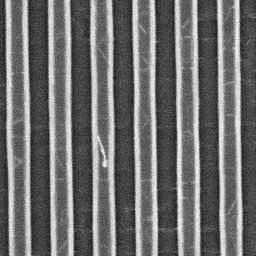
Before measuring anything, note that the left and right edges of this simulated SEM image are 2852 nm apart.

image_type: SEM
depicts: wiring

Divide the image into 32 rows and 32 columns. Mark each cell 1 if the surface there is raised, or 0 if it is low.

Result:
01100011000011000110001100011100
01100011000011000110001100011100
01100011100011000110001100011100
01100011100011000110001100011100
01100011100011000110001100001100
01100011100011000110001100001100
01100011100011000110001100001100
01100011100011000110001100001100
01100011100011000110001100001100
01100011100011000110001100001100
01100011100011000110001100001100
01100011100011000110001110001100
01100011100011000110001110001100
01100011100011000110001110001100
01100011100011000110001110001100
01100011100011000110001110001100
01100011100011000110001110001100
01100001100011000110001110001100
01100001100011000110001110001100
01100001100011000110001110001100
01100001100011000110001110001100
01100001100011000110001110001100
01100001100011000110001110001100
01100001100011000110001110001100
01100001100011000110000110001100
01100001100011000110000110001100
01100001100011000110000110001100
01100001100011000110000110001100
01100001100011000110000110001100
01100001100011000110000110001100
01110001100011000110000110001100
01110001100011000110000110001100